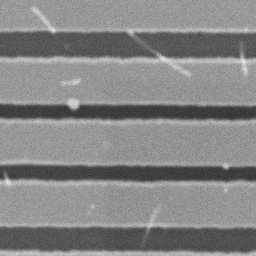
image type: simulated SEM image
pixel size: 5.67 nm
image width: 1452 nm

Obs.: lines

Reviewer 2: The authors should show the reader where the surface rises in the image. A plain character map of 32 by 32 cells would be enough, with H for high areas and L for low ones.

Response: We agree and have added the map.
HHHHHHHHHHHHHHHHHHHHHHHHHHHHHHHH
HHHHHHHHHHHHHHHHHHHHHHHHHHHHHHHH
HHHHHHHHHHHHHHHHHHHHHHHHHHHHHHHH
HHHHHHHHHHHHHHHHHHHHHHHHHHHHHHHH
LLLLLLLLLLLLLLLLLLLLLLLLLLLLLLLL
LLLLLLLLLLLLLLLLLLLLLLLLLLLLLLLL
LLLLLLLLLLLLLLLLLLLLLLLLLLLLLLLL
HHHHHHHHHHHHHHHHHHHHHHHHHHHHHHHH
HHHHHHHHHHHHHHHHHHHHHHHHHHHHHHHH
HHHHHHHHHHHHHHHHHHHHHHHHHHHHHHHH
HHHHHHHHHHHHHHHHHHHHHHHHHHHHHHHH
HHHHHHHHHHHHHHHHHHHHHHHHHHHHHHHH
HHHHHHHHHHHHHHHHHHHHHHHHHHHHHHHH
LLLLLLLLLHLLLLLLLLLLLLLLLLLLLLLL
LLLLLLLLLLLLLLLLLLLLLLLLLLLLLLLL
HHHHHHHHHHHHHHHHHHHHHHHHHHHHHHHH
HHHHHHHHHHHHHHHHHHHHHHHHHHHHHHHH
HHHHHHHHHHHHHHHHHHHHHHHHHHHHHHHH
HHHHHHHHHHHHHHHHHHHHHHHHHHHHHHHH
HHHHHHHHHHHHHHHHHHHHHHHHHHHHHHHH
HHLLHHHHHHHHHHHHHHHHHHHHHHHHHHHH
LLLLLLLLLLLLLLLLLLLLLLLLLLLLLLLL
HLHLLLLLLLLLLLLLLLLLLLLLLLLLLLLL
HHHHHHHHHHHHHHHHHHHHHHHHHHHHHHHH
HHHHHHHHHHHHHHHHHHHHHHHHHHHHHHHH
HHHHHHHHHHHHHHHHHHHHHHHHHHHHHHHH
HHHHHHHHHHHHHHHHHHHHHHHHHHHHHHHH
HHHHHHHHHHHHHHHHHHHHHHHHHHHHHHHH
LLLLLLLLLLLLLLLLLLLLLLLLLLLLLLLL
LLLLLLLLLLLLLLLLLLLLLLLLLLLLLLLL
LLLLLLLLLLLLLLLLLLLLLLLLLLLLLLLL
HHHHHLLHHHHHHHHLHLLLLLHHLLLLLLLL